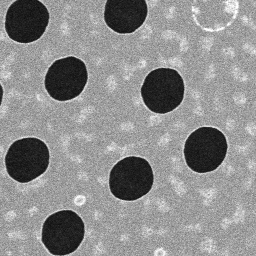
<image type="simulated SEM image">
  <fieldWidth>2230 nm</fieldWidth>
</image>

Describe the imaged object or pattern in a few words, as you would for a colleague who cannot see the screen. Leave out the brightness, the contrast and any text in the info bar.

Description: holes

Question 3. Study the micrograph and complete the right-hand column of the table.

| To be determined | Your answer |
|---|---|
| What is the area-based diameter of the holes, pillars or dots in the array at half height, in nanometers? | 390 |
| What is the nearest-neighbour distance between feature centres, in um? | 0.693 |